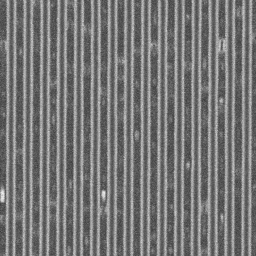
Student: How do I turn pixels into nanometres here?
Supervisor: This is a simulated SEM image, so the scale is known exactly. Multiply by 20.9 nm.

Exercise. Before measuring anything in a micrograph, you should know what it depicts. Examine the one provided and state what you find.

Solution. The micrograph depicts parallel lines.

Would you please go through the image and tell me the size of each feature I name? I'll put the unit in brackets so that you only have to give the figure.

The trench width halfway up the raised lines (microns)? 0.185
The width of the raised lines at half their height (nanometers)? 167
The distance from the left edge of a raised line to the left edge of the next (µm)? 0.351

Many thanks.